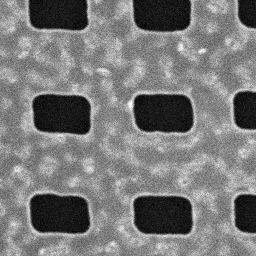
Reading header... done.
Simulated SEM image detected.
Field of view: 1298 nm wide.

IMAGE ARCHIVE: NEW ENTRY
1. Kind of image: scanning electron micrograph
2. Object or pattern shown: holes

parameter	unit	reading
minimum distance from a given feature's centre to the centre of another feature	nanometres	511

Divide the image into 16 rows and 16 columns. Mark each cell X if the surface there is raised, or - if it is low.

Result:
XX---XXX----XXX-
XX---XXXX---XXX-
XXXXXXXXXXXXXXXX
XXXXXXXXXXXXXXXX
XXXXXXXXXXXXXXXX
XXXXXXXXXXXXXXXX
XX----XX----XXX-
XX----XX----XXX-
XXXXXXXXXXXXXXXX
XXXXXXXXXXXXXXXX
XXXXXXXXXXXXXXXX
XXXXXXXXXXXXXXXX
XX---XXXX---XXX-
XX----XX----XXX-
XXX--XXXX---XXX-
XXXXXXXXXXXXXXXX